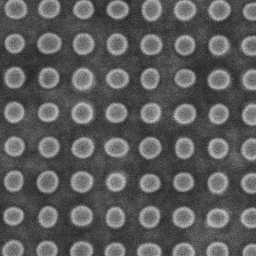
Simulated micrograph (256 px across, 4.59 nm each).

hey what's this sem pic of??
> a regular array of raised bodies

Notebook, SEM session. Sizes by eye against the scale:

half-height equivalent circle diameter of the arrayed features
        90.2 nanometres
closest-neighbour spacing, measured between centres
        155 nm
